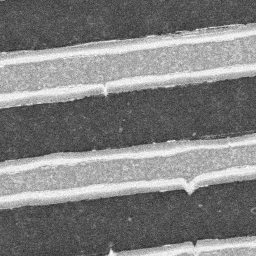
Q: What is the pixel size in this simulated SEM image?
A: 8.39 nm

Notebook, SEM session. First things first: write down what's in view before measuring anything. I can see one or a few lines or trenches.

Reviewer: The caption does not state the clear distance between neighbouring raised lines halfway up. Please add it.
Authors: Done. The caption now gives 610 nanometres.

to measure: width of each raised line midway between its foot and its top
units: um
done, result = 0.276